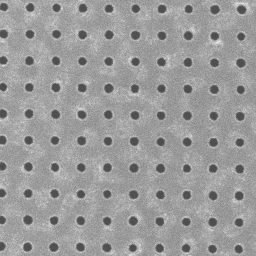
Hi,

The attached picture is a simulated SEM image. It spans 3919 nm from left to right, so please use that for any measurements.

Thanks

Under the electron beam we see a regular array of holes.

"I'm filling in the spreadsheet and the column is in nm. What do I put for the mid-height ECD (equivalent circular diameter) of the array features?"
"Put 144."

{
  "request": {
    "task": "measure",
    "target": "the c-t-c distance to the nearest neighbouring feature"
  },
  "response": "402 nm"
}